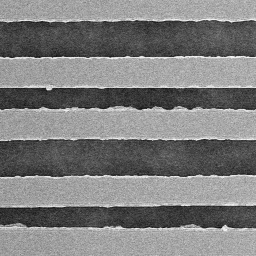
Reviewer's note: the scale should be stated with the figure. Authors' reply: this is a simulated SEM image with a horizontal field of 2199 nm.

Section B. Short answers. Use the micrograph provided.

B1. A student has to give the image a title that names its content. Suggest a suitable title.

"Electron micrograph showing lines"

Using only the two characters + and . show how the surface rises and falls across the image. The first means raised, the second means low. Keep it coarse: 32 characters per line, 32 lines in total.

++++++++++++++++++++++++++++++++
++++++++++++++++++++++++++++++++
+++++++++++++++.+..++.+++..++++.
................................
................................
................................
................................
++++++++++++++++++++++++++++++++
++++++++++++++++++++++++++++++++
++++++++++++++++++++++++++++++++
++++++++++++++++++++++++++++++++
................................
................................
................................
++++++++++++++++++++++++++++++++
++++++++++++++++++++++++++++++++
++++++++++++++++++++++++++++++++
+...............................
................................
................................
................................
................................
++++++++++++++++++++++++++++++++
++++++++++++++++++++++++++++++++
++++++++++++++++++++++++++++++++
++++++++++++++++++++++++++++++++
................................
................................
.+++++.+....................+...
++++++++++++++++++++++++++++++++
++++++++++++++++++++++++++++++++
++++++++++++++++++++++++++++++++